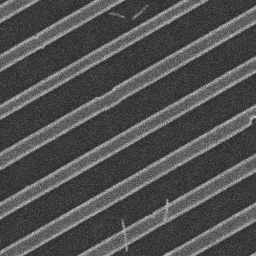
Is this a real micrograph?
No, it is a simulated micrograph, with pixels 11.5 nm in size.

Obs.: parallel lines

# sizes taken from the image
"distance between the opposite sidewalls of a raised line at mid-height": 12.7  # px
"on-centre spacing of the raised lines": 492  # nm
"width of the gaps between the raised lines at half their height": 0.351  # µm